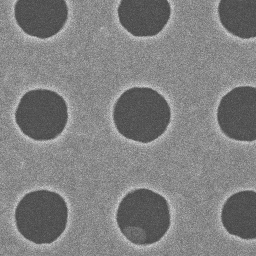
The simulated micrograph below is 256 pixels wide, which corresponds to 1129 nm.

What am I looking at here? holes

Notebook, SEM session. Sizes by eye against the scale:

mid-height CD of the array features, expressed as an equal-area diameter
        0.24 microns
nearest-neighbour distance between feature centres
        444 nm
